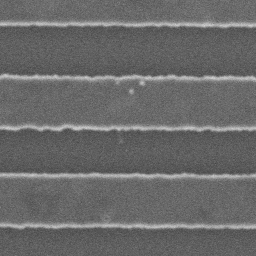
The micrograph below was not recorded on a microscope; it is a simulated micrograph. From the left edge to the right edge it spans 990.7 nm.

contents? lines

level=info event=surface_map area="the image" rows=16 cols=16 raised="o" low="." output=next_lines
oooooooooooooooo
oooooooooooooooo
................
................
................
oooooooooooooooo
oooooooooooooooo
oooooooooooooooo
................
................
................
oooooooooooooooo
oooooooooooooooo
oooooooooooooooo
................
................